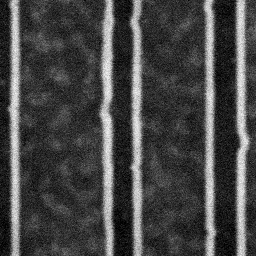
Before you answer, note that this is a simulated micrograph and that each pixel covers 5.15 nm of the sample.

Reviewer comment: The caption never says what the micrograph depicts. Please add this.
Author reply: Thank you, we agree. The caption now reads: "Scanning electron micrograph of one or a few lines or trenches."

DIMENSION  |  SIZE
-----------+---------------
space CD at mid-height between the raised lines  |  430 nm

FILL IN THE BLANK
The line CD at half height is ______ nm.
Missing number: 158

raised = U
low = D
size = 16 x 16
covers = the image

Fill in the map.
UDDDDDDUUDDDDUUD
UDDDDDDUDDDDDUUD
UDDDDDDUUDDDDUUD
UDDDDDDUUDDDDUUD
UDDDDDDUUDDDDUUD
UDDDDDDUDDDDDUUD
UDDDDDDUUDDDDUUD
UDDDDDDUUDDDDUUD
UDDDDDDUUDDDDUUD
UDDDDDDUUDDDDUUD
UDDDDDDUUDDDDUUD
UDDDDDDUUDDDDUUD
UDDDDDDUUDDDDUUD
UDDDDDDUUDDDDUUD
UDDDDDDUUDDDDUUD
UDDDDDDUUDDDDUUD